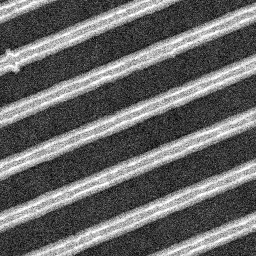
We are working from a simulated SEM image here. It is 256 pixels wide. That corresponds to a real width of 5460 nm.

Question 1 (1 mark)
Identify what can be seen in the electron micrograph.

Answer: parallel lines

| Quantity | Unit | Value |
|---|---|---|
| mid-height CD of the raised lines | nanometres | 286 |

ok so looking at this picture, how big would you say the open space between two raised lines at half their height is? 754 nm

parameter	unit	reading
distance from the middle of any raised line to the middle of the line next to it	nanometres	1030